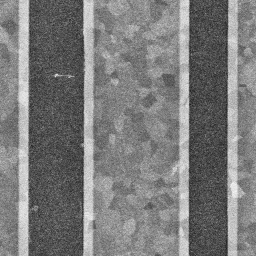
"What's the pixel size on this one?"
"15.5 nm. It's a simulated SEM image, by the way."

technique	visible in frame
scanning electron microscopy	one or a few lines or trenches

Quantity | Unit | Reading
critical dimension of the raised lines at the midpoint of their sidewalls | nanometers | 1490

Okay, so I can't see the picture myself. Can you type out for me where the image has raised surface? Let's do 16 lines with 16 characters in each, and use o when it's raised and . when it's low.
o.....oooooo...o
o....ooooooo...o
o.....oooooo...o
o.....oooooo...o
o.....oooooo...o
o.....oooooo...o
o.....oooooo...o
o.....oooooo...o
o.....oooooo...o
o.....oooooo...o
o.....oooooo...o
o.....oooooo...o
o....ooooooo...o
o.....oooooo...o
o.....oooooo...o
o.....oooooo...o